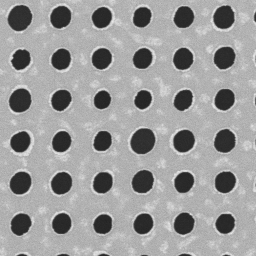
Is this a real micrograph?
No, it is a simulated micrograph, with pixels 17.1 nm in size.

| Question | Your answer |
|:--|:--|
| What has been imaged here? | a regular array of holes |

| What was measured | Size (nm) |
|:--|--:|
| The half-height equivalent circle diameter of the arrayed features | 358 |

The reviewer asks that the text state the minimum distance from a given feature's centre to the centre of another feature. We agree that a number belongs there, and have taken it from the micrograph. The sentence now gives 693 nm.